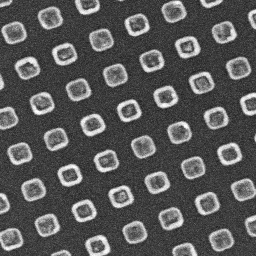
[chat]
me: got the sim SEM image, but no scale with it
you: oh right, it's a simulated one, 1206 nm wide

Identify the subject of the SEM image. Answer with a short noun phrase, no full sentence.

a regular array of raised bodies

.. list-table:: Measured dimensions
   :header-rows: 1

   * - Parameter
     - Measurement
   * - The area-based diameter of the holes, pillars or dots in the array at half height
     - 0.103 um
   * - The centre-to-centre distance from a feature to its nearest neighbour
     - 180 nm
